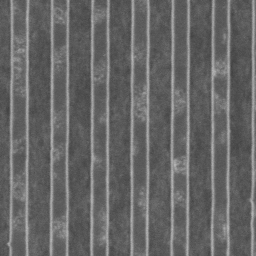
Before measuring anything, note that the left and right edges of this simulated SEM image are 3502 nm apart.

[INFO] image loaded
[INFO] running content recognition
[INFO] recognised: parallel lines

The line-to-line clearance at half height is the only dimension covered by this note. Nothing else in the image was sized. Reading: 24.1 px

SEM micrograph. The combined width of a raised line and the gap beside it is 550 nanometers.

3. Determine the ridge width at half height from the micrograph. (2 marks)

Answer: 0.219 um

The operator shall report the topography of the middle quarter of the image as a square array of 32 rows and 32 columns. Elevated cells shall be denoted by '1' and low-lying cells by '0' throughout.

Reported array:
10000001111000000111100000011110
10000001111000000111100000011110
10000001111000000111100000011110
10000001111000000111100000011110
10000001111000000111100000011110
10000001111000000111100000011110
10000001111000000111100000011110
10000001111000000111100000011110
10000001111000000111100000011110
10000001111000000111100000011110
10000001111000000111100000011110
10000001111000000111100000011110
10000001111000000111100000011110
10000001111000000111100000011110
10000001111000000111100000011110
10000001111000000111100000011110
10000001111000000111100000011110
10000001111000000111100000011110
10000001111000000111100000011110
10000001111000000111100000011110
10000001111000000111100000011110
10000001111000000111100000011110
10000001111000000111100000011110
10000001111000000111100000011110
10000001111000000111100000011110
10000001111000000111100000011110
10000001111000000111100000011110
10000001111000000111100000011110
10000001111000000111100000011110
10000001111000000111100000011110
10000001111000000111100000011110
10000001111000000111100000011110